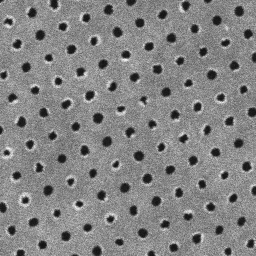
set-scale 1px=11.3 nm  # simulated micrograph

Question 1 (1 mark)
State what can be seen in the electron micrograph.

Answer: a regular array of holes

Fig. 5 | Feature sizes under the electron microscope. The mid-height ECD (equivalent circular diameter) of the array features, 0.105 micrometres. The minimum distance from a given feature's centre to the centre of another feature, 271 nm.